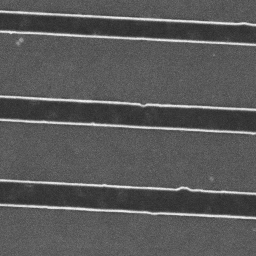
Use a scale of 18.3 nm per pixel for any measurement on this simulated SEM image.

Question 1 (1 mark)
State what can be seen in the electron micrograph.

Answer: one or a few lines or trenches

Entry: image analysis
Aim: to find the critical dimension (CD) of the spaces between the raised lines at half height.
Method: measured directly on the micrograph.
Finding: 1140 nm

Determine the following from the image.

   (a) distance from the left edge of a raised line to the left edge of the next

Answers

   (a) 1560 nanometres